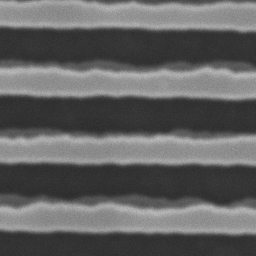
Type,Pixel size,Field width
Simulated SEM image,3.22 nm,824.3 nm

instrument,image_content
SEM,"lines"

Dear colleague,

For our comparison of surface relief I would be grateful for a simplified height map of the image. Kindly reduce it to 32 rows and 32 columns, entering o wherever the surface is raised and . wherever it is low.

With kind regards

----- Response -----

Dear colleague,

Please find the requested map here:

oooooooooooooooooooooooooooooooo
oooooooooooooooooooooooooooooooo
oooooooooooooooooooooooooooooooo
..................oooooooooooooo
................................
................................
................................
................................
oooooooooooooooooooooo.ooooooooo
oooooooooooooooooooooooooooooooo
oooooooooooooooooooooooooooooooo
oooooooooooooooooooooooooooooooo
................................
................................
................................
................................
.ooooooo..............oo........
oooooooooooooooooooooooooooooooo
oooooooooooooooooooooooooooooooo
oooooooooooooooooooooooooooooooo
..........o.o..o....ooo..ooooooo
................................
................................
................................
................................
ooooooooooooooooo.ooooooooo..ooo
oooooooooooooooooooooooooooooooo
oooooooooooooooooooooooooooooooo
oooooooooooooooooooooooooooooooo
................................
................................
................................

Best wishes